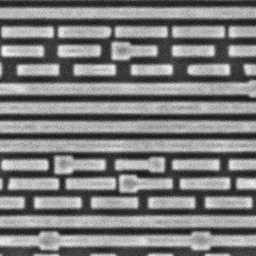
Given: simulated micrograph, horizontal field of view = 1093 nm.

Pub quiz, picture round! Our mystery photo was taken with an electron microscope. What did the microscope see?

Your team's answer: wiring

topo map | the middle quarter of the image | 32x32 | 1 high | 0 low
00011111111110000111111111100000
00011111111110000111111111100001
00011111111110000111111100000000
00000000000000000000000000000000
00000000000000000000000000000000
11111111111111111111111111111111
11111111111111111111111111111111
11111111111111111111111111111111
00000000000000000000000000000000
00000000000000000000000000000000
11111111111111111111111111111111
11111111111111111111111111111111
00000000000000000000000000000000
00000000000000000000000000000000
00000000000000000011111111111111
11111111111111111111111111111111
11111111111111111111111111111111
00000000000000000000000000000000
00000000000000000000000000000000
11111111111111111111111111111111
11111111111111111111111111111111
11111111111111111111111111111111
00000000000000000000000000000000
11000000000000000000000000000000
11111111110001111111111110011111
11111111110001111111111110011111
11000000000000000000011110000000
00000000000000000000000000000000
00000000000000111100000000000000
01111111111110111111111111100111
01111111111110111111111111100111
00000000000000111100000000000000